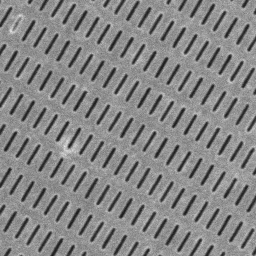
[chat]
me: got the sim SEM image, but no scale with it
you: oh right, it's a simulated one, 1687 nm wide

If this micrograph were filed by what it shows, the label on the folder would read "a regular array of holes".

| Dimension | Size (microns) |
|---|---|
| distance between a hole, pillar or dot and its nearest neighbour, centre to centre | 0.087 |